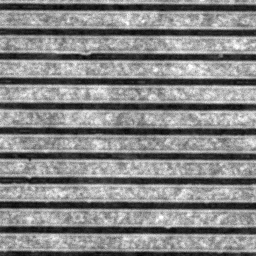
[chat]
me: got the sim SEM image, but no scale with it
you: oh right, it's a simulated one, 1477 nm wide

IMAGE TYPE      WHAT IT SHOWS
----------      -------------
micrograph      parallel lines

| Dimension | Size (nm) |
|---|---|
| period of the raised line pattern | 143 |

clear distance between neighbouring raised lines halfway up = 46.9 nanometres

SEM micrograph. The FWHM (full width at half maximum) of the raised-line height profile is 93.8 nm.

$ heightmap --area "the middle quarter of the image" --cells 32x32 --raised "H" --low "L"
HHHHHHHHHHHHHHHHHHHHHHHHHHHHHHHH
HHHHHHHHHHHHHHHHHHHHHHHHHHHHHHHH
HHHHHHHHHHHHHHHHHHHHHHHHHHHHHHHH
LLLLLLLLLLLLLLLLLLLLLLLLLLLLLLLL
LLLLLLLLLLLLLLLLLLLLLLLLLLLLLLLL
LLLLLLLLLLLLLLLLLLLLLLLLLLLLLLLL
HHHHHHHHHHHHHHHHHHHHHHHHHHHHHHHH
HHHHHHHHHHHHHHHHHHHHHHHHHHHHHHHH
HHHHHHHHHHHHHHHHHHHHHHHHHHHHHHHH
LLLLLLLLLLLLLLLLLLLLLLLLLLLLLLHH
LLLLLLLLLLLLLLLLLLLLLLLLLLLLLLLL
LLLLLLLLLLLLLLLLLLLLLLLLLLLLLLLL
HHHHHHHHHHHHHHHHHHHHHHHHHHHHHHHH
HHHHHHHHHHHHHHHHHHHHHHHHHHHHHHHH
HHHHHHHHHHHHHHHHHHHHHHHHHHHHHHHH
HHHHHHHHHHHHHHHHHHHHHHHHHHHHHHHH
LLLLLLLLLLLLLLLLLLLLLLLLLLLLLLLL
LLLLLLLLLLLLLLLLLLLLLLLLLLLLLLLL
HHHHHHHHHHHHHHHHHHHHHHHHHHHHHHHH
HHHHHHHHHHHHHHHHHHHHHHHHHHHHHHHH
HHHHHHHHHHHHHHHHHHHHHHHHHHHHHHHH
HHHHHHHHHHHHHHHHHHHHHHHHHHHHHHHH
LLLLLLLLLLLLLLLLLLLLLLLLLLLLLLLL
LLLLLLLLLLLLLLLLLLLLLLLLLLLLLLLL
HHHHHHHHHHHHHHHHHHHHHHHHHHHHHHHH
HHHHHHHHHHHHHHHHHHHHHHHHHHHHHHHH
HHHHHHHHHHHHHHHHHHHHHHHHHHHHHHHH
HHHHHHHHHHHHHHHHHHHHHHHHHHHHHHHH
LLLLLLLLLLLLLLLLLLLLLLLLLLLLLLLL
LLLLLLLLLLLLLLLLLLLLLLLLLLLLLLLL
HHHHHHHHHHHHHHHHHHHHHHHHHHHHHHHH
HHHHHHHHHHHHHHHHHHHHHHHHHHHHHHHH